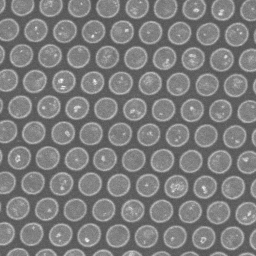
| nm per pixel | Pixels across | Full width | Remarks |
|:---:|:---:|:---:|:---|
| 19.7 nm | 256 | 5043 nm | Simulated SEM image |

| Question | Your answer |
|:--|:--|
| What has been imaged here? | a regular array of raised bodies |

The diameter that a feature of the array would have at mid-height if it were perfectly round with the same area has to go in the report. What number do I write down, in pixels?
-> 22.4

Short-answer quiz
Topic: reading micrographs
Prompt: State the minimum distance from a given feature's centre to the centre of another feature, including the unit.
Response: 561 nm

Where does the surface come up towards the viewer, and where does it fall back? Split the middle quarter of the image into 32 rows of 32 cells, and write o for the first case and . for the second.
..ooo....ooo....oooo...oooo...oo
................................
oo....ooo....ooo....ooo.....oo..
ooo..ooooo..ooooo..ooooo..ooooo.
ooo.oooooo.oooooo..ooooo..ooooo.
oo..oooooo.oooooo..ooooo..ooooo.
o....oooo...oooo...ooooo..ooooo.
....................oo.....oo...
..ooo...........................
.ooooo..ooooo...oooo...oooo...oo
.ooooo..ooooo..ooooo..ooooo...oo
.ooooo..ooooo..ooooo..oooooo.ooo
.oooo...ooooo..ooooo..ooooo..ooo
..oo.....ooo....ooo....oooo...oo
................................
oo...oooo...oooo....ooo....ooo..
oo..ooooo..oooooo..ooooo..ooooo.
oo..oooooo.oooooo..ooooo..ooooo.
oo..ooooo..oooooo..ooooo..ooooo.
o....ooo....oooo...oooo...oooo..
...........................o....
..ooo....ooo....ooo.............
.ooooo..ooooo..ooooo...oooo...oo
oooooo.oooooo..ooooo..ooooo..ooo
oooooo.oooooo..ooooo..ooooo..ooo
.oooo...oooo...ooooo..ooooo..ooo
.........oo.....oo.....ooo....oo
o.....oo........................
oo..ooooo...oooo...oooo....ooo..
oo..ooooo..ooooo..oooooo..ooooo.
oo..ooooo..ooooo..oooooo.oooooo.
o...ooooo..ooooo..ooooo..oooooo.